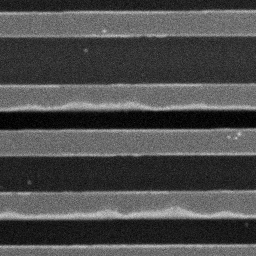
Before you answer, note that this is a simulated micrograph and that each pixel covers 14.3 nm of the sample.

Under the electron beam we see lines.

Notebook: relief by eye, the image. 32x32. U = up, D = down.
DDDDDDDDDDDDDDDDDDDDDDDDDDDDDDDD
DDDDDDDDUUUUUUUUUUUUUUUUUUUUUUUU
UUUUUUUUUUUUUUUUUUUUUUUUUUUUUUUU
UUUUUUUUUUUUUUUUUUUUUUUUUUUUUUUU
UUUUUUUUUUUUUUUUUDUUUDDDDDDDDDDD
DDDDDDDDDDDDDDDDDDDDDDDDDDDDDDDD
DDDDDDDDDDDDDDDDDDDDDDDDDDDDDDDD
DDDDDDDDDDDDDDDDDDDDDDDDDDDDDDDD
DDDDDDDDDDDDDDDDDDDDDDDDDDDDDDDD
DDDDDDDDDDDDDDDDDDDDDDDDDDDDDDDD
DDDDDDDDDDDDDDDDDDDDDDDDDDDDDDDD
UUUUUUUUUUUUUUUUUUUUUUUUUUUUUUUU
UUUUUUUUUUUUUUUUUUUUUUUUUUUUUUUU
UUUUUUUUUUUUUUUUUUUUUUUUUUUUUUUU
DDDDDDDDDDDDDDDDDDDDDDDDDDDDDDDD
DDDDDDDDDDDDDDDDDDDDDDDDDDDDDDDD
UUUUUUUUUUUUUUUUUUUUUUUUUUUUUUUU
UUUUUUUUUUUUUUUUUUUUUUUUUUUUUUUU
UUUUUUUUUUUUUUUUUUUUUUUUUUUUUUUU
DDDDDDDDDDDDDDDDDDDDDDDDDDDDDDDD
DDDDDDDDDDDDDDDDDDDDDDDDDDDDDDDD
DDDDDDDDDDDDDDDDDDDDDDDDDDDDDDDD
DDDDDDDDDDDDDDDDDDDDDDDDDDDDDDDD
DDDDDDDDDDDDDDDDDDDDDDDDDDDDDDDD
UUUUUUUUUUUUUUUUUUUUUUUUUUUUUUUU
UUUUUUUUUUUUUUUUUUUUUUUUUUUUUUUU
UUUUUUUUUUUUUUUUUUUUUUUUUUUUUUUU
DDDDDDDDDDDDDDDDDDDDDDDDDDDDDDDD
DDDDDDDDDDDDDDDDDDDDDDDDDDDDDDDD
DDDDDDDDDDDDDDDDDDDDDDDDDDDDDDDD
DDDDDDDDDDDDDDDDDDDDDDDDDDDDDDDD
UUUUUUUUUUUUUUUUUUUUUUUUUUUUUUUU